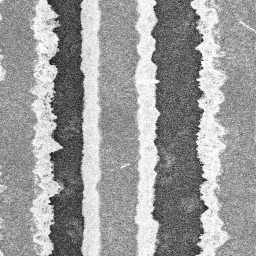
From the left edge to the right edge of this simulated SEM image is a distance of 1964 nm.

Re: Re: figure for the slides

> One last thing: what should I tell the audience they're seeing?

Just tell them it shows one or a few lines or trenches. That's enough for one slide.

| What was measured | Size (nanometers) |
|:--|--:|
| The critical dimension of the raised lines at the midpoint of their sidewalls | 428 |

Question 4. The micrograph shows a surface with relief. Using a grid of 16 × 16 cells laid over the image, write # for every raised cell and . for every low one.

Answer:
###...###....###
###...###....###
###...###....###
###...###....###
###...###....###
###...###....###
###...###....###
###...###....###
###...###....###
###...###....###
###...###....###
###...###....###
###...###....###
###...###....###
###...###....###
###...###....###